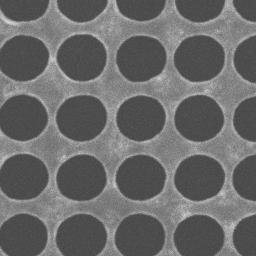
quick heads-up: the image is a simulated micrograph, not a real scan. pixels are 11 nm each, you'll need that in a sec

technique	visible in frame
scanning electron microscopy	a regular array of holes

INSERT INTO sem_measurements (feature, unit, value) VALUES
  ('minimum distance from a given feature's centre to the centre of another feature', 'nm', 642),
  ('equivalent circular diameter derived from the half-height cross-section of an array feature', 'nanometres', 538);